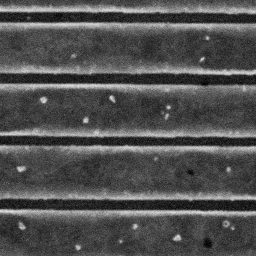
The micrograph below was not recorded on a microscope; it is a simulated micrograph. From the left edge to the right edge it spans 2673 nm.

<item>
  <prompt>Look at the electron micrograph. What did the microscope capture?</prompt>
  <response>lines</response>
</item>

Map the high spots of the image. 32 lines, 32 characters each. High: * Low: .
********************************
................................
................................
******************************..
********************************
********************************
********************************
********************************
********************************
................................
................................
********************************
********************************
********************************
********************************
********************************
******.*************************
................................
...............**...............
********************************
********************************
********************************
********************************
********************************
...........*********************
................................
****.................****.......
********************************
********************************
********************************
********************************
********************************